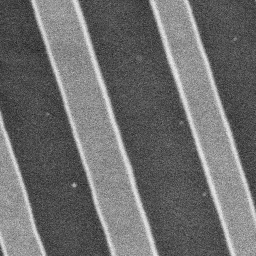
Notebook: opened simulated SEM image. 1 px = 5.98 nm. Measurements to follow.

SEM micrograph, lines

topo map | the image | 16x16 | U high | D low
DDUUUDDDDDUUDDDD
DDUUUDDDDDUUDDDD
DDDUUUDDDDUUDDDD
DDDUUUDDDDDUUDDD
DDDUUUDDDDDUUDDD
DDDDUUDDDDDUUDDD
DDDDUUUDDDDDUUDD
DDDDUUUDDDDDUUDD
DDDDDUUDDDDDUUDD
UDDDDUUUDDDDUUUD
UDDDDUUUDDDDDUUD
UDDDDDUUDDDDDUUD
UUDDDDUUUDDDDUUU
UUDDDDUUUDDDDDUU
UUDDDDDUUDDDDDUU
UUUDDDDUUUDDDDUU